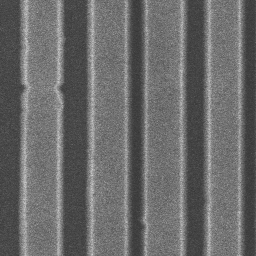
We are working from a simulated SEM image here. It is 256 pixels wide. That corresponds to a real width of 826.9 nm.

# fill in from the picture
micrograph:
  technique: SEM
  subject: one or a few lines or trenches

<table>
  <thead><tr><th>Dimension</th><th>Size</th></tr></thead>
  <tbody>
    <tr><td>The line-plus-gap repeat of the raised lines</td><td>197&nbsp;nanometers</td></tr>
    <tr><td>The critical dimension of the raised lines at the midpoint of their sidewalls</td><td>126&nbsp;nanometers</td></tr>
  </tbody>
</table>